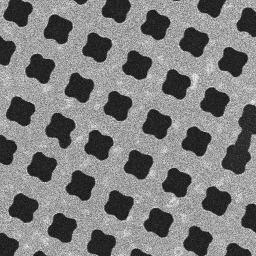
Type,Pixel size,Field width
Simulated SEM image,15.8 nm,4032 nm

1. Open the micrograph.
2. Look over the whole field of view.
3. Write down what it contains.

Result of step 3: a regular array of holes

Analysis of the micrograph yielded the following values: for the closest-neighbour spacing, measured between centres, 672 nm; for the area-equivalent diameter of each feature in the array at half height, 27.5 px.